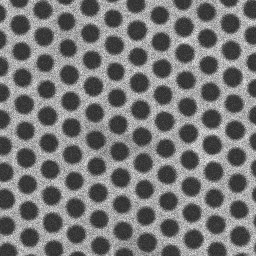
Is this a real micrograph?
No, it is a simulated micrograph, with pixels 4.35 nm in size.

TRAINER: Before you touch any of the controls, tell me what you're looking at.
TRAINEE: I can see a regular array of holes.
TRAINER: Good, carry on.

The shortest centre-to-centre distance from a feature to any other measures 115 nm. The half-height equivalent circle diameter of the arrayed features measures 85.2 nanometres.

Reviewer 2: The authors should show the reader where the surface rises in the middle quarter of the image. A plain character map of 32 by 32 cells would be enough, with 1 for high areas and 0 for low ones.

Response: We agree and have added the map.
00111000011000011101110000011111
00011111111000011111110000011111
00001111111000011100111000011000
00001100011000011000011101110000
00011000001111110000011111110000
11111000001111110000011100110000
11111000001100011000011000011111
00011100011000011111110000011111
00001111111000001111111000011100
00001111111000001100011000011000
00001100011100111000011111110000
10011000001111111000001111111000
11111000001111111000011000011000
10111100001100011100011000001111
00001110011000001111111000001111
00001111111000001111111000011100
00001111111100001100011100011000
00001100001110011000001111111000
11111000001111111000001111111000
11111100001110111000001100011100
10011100001100001100111000001111
00001111111000001111111000001110
00000111111100001110011000011000
00000110011100001100001110111000
10001100001111111000001111111000
11111100000111111000001110011000
11111100001110001100001100001110
10001110001100000111111000001111
00000111111100000111111000001110
00000111111100001110001100001100
10000110001110001100001111111000
11011100000111111100000111111000